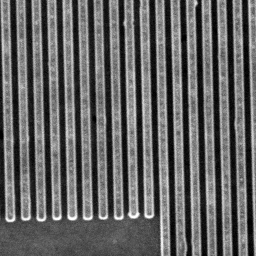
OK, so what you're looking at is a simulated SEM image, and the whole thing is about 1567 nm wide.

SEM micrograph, parallel lines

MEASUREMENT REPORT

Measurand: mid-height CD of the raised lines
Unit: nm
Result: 52.7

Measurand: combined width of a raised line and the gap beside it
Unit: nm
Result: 94.6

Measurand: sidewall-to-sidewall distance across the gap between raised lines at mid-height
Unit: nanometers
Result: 42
